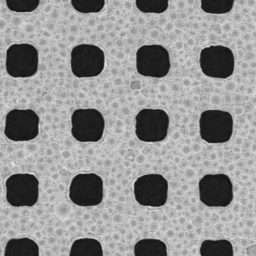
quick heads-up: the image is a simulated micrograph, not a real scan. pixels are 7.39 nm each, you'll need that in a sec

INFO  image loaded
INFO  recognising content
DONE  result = a regular array of holes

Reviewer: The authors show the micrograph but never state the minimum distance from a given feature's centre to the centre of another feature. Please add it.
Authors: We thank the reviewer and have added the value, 475 nanometres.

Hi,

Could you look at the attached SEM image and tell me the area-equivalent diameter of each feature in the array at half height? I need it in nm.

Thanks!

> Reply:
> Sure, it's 258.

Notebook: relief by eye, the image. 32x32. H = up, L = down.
HLLLLHHHHLLLLHHHHLLLLHHHHLLLLHHH
HHLLHHHHHHLLHHHHHHLLHHHHHHLLHHHH
HHHHHHHHHHHHHHHHHHHHHHHHHHHHHHHH
HHHHHHHHHHHHHHHHHHHHHHHHHHHHHHHH
HHHHHHHHHHHHHHHHHHHHHHHHHHHHHHHH
HHLLHHHHHHLHHHHHHHHHHHHHHHHHHHHH
HLLLLHHHHLLLLHHHHLLLLHHHHLLLLHHH
HLLLLHHHHLLLLHHHHLLLLHHHHLLLLHHH
HLLLLHHHHLLLLHHHHLLLLHHHHLLLLHHH
HLLLHHHHHHLLHHHHHHLLLHHHHHLLLHHH
HHHHHHHHHHHHHHHHHHHHHHHHHHHHHHHH
HHHHHHHHHHHHHHHHHHHHHHHHHHHHHHHH
HHHHHHHHHHHHHHHHHHHHHHHHHHHHHHHH
HHHHHHHHHHHHHHHHHHHHHHHHHHHHHHHH
HLLLLHHHHLLLLHHHHLLLLHHHHLLLLHHH
HLLLLHHHHLLLLHHHHLLLLHHHHLLLLHHH
HLLLLHHHHLLLLHHHHLLLLHHHHLLLLHHH
HLLLHHHHHHLLHHHHHHLLHHHHHLLLHHHH
HHHHHHHHHHHHHHHHHHHHHHHHHHHHHHHH
HHHHHHHHHHHHHHHHHHHHHHHHHHHHHHHH
HHHHHHHHHHHHHHHHHHHHHHHHHHHHHHHH
HHHHHHHHHHHHHHHHHHHHHHHHHHHHHHHH
HLLLLHHHHLLLLHHHHLLLLHHHHLLLLHHH
HLLLLHHHHLLLLHHHHLLLLHHHHLLLLHHH
HLLLLHHHHLLLLHHHHLLLLHHHHLLLLHHH
HLLLHHHHHLLLHHHHHHLLHHHHHHLLLHHH
HHHHHHHHHHHHHHHHHHHHHHHHHHHHHHHH
HHHHHHHHHHHHHHHHHHHHHHHHHHHHHHHH
HHHHHHHHHHHHHHHHHHHHHHHHHHHHHHHH
HHHHHHHHHHHHHHHHHHHHHHHHHHHHHHHH
HLLLLHHHHLLLLHHHHLLLLHHHHLLLLHHH
HLLLLHHHHLLLLHHHHLLLLHHHHLLLLHHH